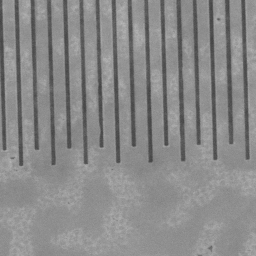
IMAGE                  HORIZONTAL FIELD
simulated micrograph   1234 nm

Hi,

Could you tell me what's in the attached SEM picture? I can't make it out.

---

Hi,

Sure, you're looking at parallel lines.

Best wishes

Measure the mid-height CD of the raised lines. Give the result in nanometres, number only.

55.4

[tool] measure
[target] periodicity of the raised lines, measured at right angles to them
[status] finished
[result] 77.9 nm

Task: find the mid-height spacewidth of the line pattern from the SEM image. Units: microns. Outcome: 0.0211